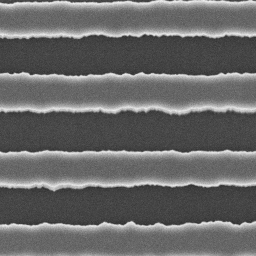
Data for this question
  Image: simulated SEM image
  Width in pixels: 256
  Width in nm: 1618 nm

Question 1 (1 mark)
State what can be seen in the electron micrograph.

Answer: lines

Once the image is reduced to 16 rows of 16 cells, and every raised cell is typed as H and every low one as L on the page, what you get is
HHHHHHHHHHHHHHHH
HHHHHHHHHHHHHHHH
LLLLLLLLLLLLLLLL
LLLLLLLLLLLLLLLL
LLLLLLLLLLLLLLLL
HHHHHHHHHHHHHHHH
HHHHHHHHHHHHHHHH
LLLLLLLLLLLLLLLL
LLLLLLLLLLLLLLLL
LLLHLLHHLLHLHLHL
HHHHHHHHHHHHHHHH
HHHHHHHHHHHHHHHH
LLLLLLLLLLLLLLLL
LLLLLLLLLLLLLLLL
HHHHHHHHHHHHHHHH
HHHHHHHHHHHHHHHH